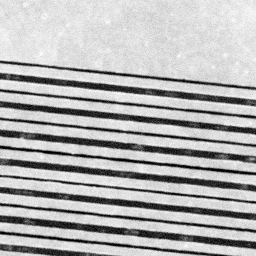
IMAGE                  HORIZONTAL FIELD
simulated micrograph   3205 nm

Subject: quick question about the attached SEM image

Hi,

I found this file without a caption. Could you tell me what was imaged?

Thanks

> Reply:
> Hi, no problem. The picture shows parallel lines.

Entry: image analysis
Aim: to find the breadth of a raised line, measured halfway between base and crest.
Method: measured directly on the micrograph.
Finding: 107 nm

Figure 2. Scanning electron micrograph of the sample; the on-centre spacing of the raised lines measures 178 nm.